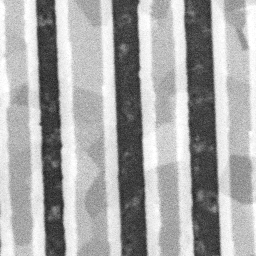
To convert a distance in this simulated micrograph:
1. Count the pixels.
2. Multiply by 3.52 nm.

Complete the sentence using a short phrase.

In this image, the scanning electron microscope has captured one or a few lines or trenches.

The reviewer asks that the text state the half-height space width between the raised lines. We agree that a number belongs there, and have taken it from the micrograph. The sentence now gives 121 nm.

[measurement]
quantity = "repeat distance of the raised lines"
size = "264 nm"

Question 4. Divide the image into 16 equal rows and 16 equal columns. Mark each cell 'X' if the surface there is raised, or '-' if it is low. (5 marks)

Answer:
XX--XXX--XX---XX
XX--XXX--XX---XX
XX--XXX--XX---XX
XX--XXX--XX---XX
XX--XXX--XX---XX
XX--XXX--XX---XX
XX--XXX--XX---XX
XX--XXX--XXX--XX
XX--XXX--XXX--XX
XX--XXX--XXX--XX
XX--XXX--XXX--XX
XX--XXX--XXX--XX
XX--XXX--XXX--XX
XX--XXX--XXX--XX
XXX-XXX--XXX--XX
XXX-XXX--XXX--XX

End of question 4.